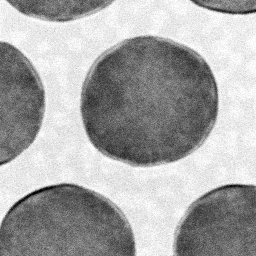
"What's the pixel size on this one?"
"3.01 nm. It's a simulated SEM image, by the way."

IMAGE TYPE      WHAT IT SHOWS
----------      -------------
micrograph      holes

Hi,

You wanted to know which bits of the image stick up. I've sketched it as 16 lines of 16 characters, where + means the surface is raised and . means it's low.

+......++++++...
++++++++++++++++
++++++++...+++++
..++++.......+++
..+++........+++
...++.........++
...++.........++
...++........+++
..+++........+++
.+++++......++++
++++++++++++++++
++++++++++++++++
+......+++++....
........+++.....
........+++.....
........+++.....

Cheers